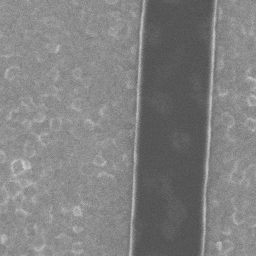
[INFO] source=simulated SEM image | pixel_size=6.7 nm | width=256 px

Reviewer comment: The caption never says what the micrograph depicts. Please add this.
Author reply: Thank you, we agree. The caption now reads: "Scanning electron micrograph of one or a few lines or trenches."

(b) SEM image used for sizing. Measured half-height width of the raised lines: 493 nm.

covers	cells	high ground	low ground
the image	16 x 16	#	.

.........####...
.........####...
.........####...
.........####...
.........####...
.........####...
.........####...
.........####...
........#####...
........#####...
........#####...
........#####...
........#####...
........#####...
........#####...
........#####...